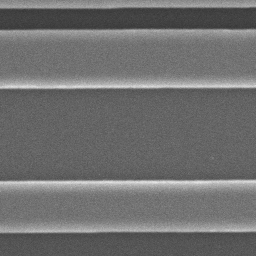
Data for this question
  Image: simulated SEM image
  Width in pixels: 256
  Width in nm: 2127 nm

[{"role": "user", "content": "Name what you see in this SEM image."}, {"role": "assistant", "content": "lines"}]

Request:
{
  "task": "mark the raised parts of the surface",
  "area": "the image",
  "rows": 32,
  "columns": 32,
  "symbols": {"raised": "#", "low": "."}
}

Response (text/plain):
################################
................................
................................
................................
################################
################################
################################
################################
################################
################################
################################
................................
................................
................................
................................
................................
................................
................................
................................
................................
................................
................................
................................
################################
################################
################################
################################
################################
################################
................................
................................
................................